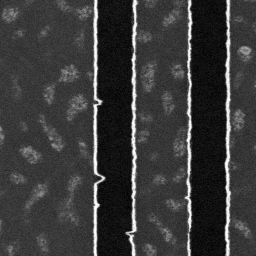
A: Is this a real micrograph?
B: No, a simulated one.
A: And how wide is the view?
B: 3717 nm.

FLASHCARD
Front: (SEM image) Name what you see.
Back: one or a few lines or trenches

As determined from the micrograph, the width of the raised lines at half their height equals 38.9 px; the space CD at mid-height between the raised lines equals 802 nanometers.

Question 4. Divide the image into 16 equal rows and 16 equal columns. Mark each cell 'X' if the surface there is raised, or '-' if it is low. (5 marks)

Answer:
------XX----XX--
------XX----XX--
------XX----XX--
------XX----XX--
------XX----XX--
------XX----XX--
------XX----XX--
------XX----XX--
------XX----XX--
------XX----XX--
------XX----XX--
------XX----XX--
------XX----XX--
------XX----XX--
------XX----XX--
------XX----XX--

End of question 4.